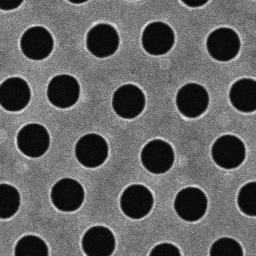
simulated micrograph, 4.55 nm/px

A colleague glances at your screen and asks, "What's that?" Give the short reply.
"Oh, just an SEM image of a regular array of holes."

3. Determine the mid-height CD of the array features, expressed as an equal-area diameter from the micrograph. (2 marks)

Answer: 151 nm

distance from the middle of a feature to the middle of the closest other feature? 251 nanometres